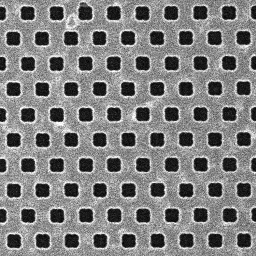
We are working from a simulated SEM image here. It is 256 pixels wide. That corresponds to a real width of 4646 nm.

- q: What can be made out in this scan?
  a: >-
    a regular array of holes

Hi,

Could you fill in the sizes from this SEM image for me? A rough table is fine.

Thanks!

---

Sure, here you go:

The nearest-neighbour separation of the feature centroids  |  516 nanometres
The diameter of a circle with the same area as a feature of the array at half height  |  278 nm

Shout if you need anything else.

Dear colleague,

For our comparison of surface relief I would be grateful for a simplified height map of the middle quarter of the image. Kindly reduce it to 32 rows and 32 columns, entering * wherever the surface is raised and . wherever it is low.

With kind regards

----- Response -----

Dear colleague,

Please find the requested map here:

****...****...****....***....***
****...****...*****..*****..****
********************************
********************************
*..*****..*****..******.******.*
....***....***....***....****...
....***....***....****...****...
....****..****....****...****...
********************************
********************************
********************************
****...****...****...****....***
****...****...****....***....***
****...****...****...****....***
*****.**************.***********
********************************
********************************
...*****..****....****...****...
....***....***....****...****...
....***....***....***....****...
*..*****..*****..*****...*****..
********************************
********************************
****..******.******.******..****
****...****...****....***....***
****...****...****....***....***
****...****...****...****....***
********************************
********************************
********************************
...****....****...****...****...
....***....***....****...****...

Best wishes